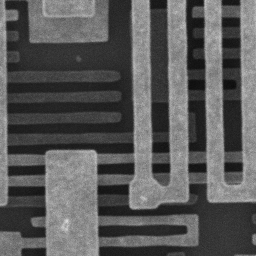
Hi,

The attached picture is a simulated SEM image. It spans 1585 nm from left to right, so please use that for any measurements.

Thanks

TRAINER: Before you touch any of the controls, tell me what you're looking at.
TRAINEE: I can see wiring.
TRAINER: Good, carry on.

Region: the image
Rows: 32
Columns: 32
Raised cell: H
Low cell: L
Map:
HLLLLHHHHHHHLLLLLHHLLHHLLLHHLLHH
HLLLLHHHHHHHLLLLLHHLLHHLLLHHLLHH
HLLLLLLLLLLLLLLLLHHLLHHLLLHHLLHH
HLLLLLLLLLLLLLLLLHHLLHHLLLHHLLHH
HLLLLLLLLLLLLLLLLHHLLHHLLLHHLLHH
HLLLLLLLLLLLLLLLLHHLLHHLLLHHLLHH
HLLLLLLLLLLLLLLLLHHLLHHLLLHHLLHH
HLLLLLLLLLLLLLLLLHHLLHHLLLHHLLHH
HLLLLLLLLLLLLLLLLHHLLHHLLLHHLLHH
HLLLLLLLLLLLLLLLLHHLLHHLLLHHLLHH
HLLLLLLLLLLLLLLLLHHLLHHLLLHHLLHH
HLLLLLLLLLLLLLLLLHHLLHHLLLHHLLHH
HLLLLLLLLLLLLLLLLHHLLHHLLLHHLLHH
HLLLLLLLLLLLLLLLLHHLLHHLLLHHLLHH
HLLLLLLLLLLLLLLLLHHLLHHLLLHHLLHH
HLLLLLLLLLLLLLLLLHHLLHHLLLHHLLHH
HLLLLLLLLLLLLLLLLHHLLHHLLLHHLLHH
HLLLLLLLLLLLLLLLLHHLLHHHLLHHLLHH
HLLLLLLLLLLLLLLLLHHLLHHHLLHHLLHH
HLLLLLHHHHHHLLLLLHHLLHHLLLHHLLHH
HLLLLLHHHHHHLLLLLHHLLHHLLLHHLLHH
HLLLLLHHHHHHLLLLLHHLLHHLLLHHLLHH
HLLLLLHHHHHHLLLLLHHLLHHHLLHHLLHH
HLLLLLHHHHHHLLLLHHHHHHHHLLHHHHHH
HLLLLLHHHHHHLLLLHHHHHHHHLLHHHHHH
HLLLLLHHHHHHLLLLHHHHLLLLLLLLLLLL
LLLLLLHHHHHHLLLLLLLLLLLLLLLLLLLL
LLLLLLHHHHHHLLLLLLLLLLLLLLLLLLLL
LLLLLLHHHHHHLLLLLLLLLLLLLLLLLLLL
LLLLLLHHHHHHLLLLLLLLLLLLLLLLLLLL
LLLLLLHHHHHHLLLLLLLLLLLLLLLLLLLL
LLLLLLHHHHHHLLLLLLLLLLLLLLLLLLLL